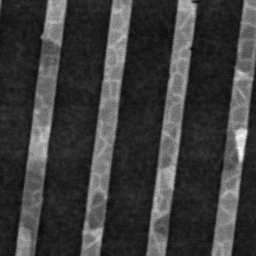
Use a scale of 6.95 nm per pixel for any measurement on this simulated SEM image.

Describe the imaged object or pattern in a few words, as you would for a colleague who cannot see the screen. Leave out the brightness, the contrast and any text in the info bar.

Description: one or a few lines or trenches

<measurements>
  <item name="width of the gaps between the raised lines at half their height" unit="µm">0.326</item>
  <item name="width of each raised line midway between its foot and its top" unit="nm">127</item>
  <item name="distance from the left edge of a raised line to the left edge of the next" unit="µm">0.451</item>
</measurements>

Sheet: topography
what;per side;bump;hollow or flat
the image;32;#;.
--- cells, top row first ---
......##......##......##......##
......##......##......##......##
......##......##......##......##
......##......##......##......##
.....###......##......##......##
.....###......##......##......##
.....##......###......##......##
.....##......###.....###......##
.....##......##......###.....###
.....##......##......##......###
.....##......##......##......###
.....##......##......##......##.
....###......##......##......##.
....###.....###......##......##.
....##......###......##......##.
....##......###.....###......##.
....##......##......###.....###.
....##......##......##......###.
....##......##......##......##..
....##......##......##......##..
...###......##......##......##..
...###.....###......##......##..
...##......###......##......##..
...##......###.....###......##..
...##......##......###......##..
...##......##......##......###..
...##......##......##......##...
..###......##......##......##...
..###......##......##......##...
..###.....###......##......##...
..##......###......##......##...
..##......##......###......##...